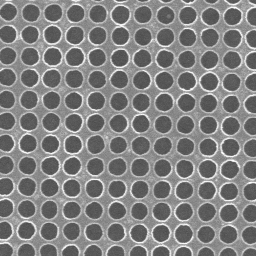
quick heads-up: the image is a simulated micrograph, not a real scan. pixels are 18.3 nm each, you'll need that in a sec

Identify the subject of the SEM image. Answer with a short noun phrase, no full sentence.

a regular array of holes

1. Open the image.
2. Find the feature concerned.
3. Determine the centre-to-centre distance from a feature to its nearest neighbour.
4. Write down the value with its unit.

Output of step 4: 396 nm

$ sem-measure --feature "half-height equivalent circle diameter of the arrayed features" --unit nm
323